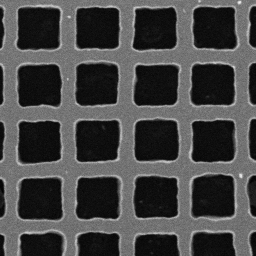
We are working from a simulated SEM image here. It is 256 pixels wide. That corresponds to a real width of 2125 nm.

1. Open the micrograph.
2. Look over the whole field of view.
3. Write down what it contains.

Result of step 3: a regular array of holes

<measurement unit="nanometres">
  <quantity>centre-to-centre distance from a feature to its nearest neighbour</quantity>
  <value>467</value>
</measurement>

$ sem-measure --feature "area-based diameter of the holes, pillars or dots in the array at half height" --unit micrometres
0.391